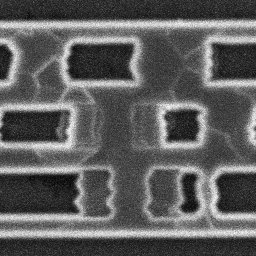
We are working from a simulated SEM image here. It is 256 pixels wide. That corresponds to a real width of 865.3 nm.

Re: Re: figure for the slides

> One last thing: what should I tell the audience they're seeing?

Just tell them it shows one or a few lines or trenches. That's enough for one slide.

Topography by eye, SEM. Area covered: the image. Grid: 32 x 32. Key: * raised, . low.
................................
................................
................................
********************************
********************************
.********........*********......
..******.........*********......
..******.........*********......
..******.........*********......
.*******.........*********......
********************************
********************************
********************************
*........************....*******
.........***********.....*******
.........***********.....*******
.........***********.....*******
.........***********.....*******
********************************
********************************
********************************
..........*************..**.....
..........************...**.....
..........************...**.....
..........*************..**.....
..........************...**.....
..........************...**.....
********************************
********************************
................................
................................
................................